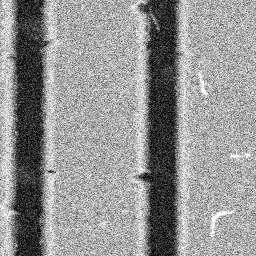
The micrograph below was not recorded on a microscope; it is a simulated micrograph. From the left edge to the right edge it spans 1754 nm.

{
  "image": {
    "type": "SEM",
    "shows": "one or a few lines or trenches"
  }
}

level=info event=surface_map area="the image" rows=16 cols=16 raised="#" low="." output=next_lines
#..######..#####
#..######..#####
#..######..#####
#..######..#####
#..######..#####
#..######..#####
#..######..#####
#..######..#####
#..######..#####
#..######..#####
#..######..#####
#..######..#####
#..######..#####
#..######..#####
#..######..#####
#..######..#####